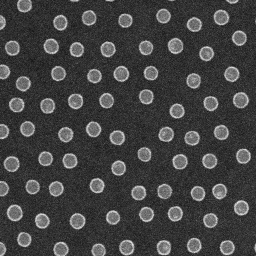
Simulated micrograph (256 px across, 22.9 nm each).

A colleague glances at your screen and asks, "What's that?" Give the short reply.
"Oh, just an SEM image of a regular array of raised bodies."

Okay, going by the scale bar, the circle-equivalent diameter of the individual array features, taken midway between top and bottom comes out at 13.5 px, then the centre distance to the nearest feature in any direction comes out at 629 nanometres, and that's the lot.